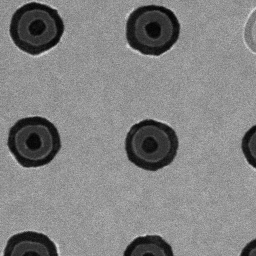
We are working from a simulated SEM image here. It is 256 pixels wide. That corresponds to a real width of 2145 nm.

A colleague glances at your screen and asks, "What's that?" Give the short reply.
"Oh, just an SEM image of ring-shaped grooves with a dot in the middle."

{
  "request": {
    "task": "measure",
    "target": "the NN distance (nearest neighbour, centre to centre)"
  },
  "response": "953 nm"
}